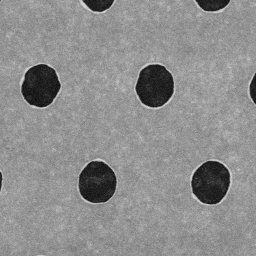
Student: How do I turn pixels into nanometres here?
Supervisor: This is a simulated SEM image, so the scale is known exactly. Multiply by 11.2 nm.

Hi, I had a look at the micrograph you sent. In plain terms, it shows holes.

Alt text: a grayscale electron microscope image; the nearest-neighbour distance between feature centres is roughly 112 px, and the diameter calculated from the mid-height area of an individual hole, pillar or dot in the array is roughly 461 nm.